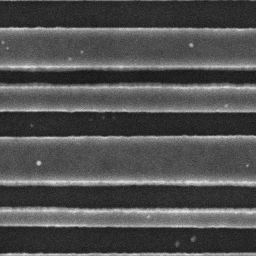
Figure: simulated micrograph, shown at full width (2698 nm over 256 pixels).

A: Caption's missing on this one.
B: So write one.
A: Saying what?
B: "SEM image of lines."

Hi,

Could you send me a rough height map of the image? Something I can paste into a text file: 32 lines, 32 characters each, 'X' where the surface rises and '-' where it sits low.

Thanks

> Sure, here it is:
--------------------------------
--------------------------------
--------------------------------
--------------------------------
XXXXXXXXXXXXXXXXXXXXXXXXXXXXXXXX
XXXXXXXXXXXXXXXXXXXXXXXXXXXXXXXX
XXXXXXXXXXXXXXXXXXXXXXXXXXXXXXXX
XXXXXXXXXXXXXXXXXXXXXXXXXXXXXXXX
-X-XXXXXXX-----X----------------
--------------------------------
--------------------------------
XXXXXXXXXXXXXXXXXXXXXXXXXXXXXXXX
XXXXXXXXXXXXXXXXXXXXXXXXXXXXXXXX
XXXXXXXXXXXXXXXXXXXXXXXXXXXXXXXX
--------------------------------
--------------------------------
--------------------------------
XXXXXXXXXXXXXXXXXXXXXXXXXXXXXXXX
XXXXXXXXXXXXXXXXXXXXXXXXXXXXXXXX
XXXXXXXXXXXXXXXXXXXXXXXXXXXXXXXX
XXXXXXXXXXXXXXXXXXXXXXXXXXXXXXXX
XXXXXXXXXXXXXXXXXXXXXXXXXXXXXXXX
XXXXXXXXXXXXXXXXXXXXXXXXXXXXXXXX
--------------------------------
--------------------------------
--------------------------------
XXXXXXXXXXXXXXXXXXXXXXXXXXXXXXXX
XXXXXXXXXXXXXXXXXXXXXXXXXXXXXXXX
--------------------------------
--------------------------------
--------------------------------
--------------------------------